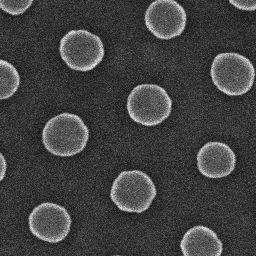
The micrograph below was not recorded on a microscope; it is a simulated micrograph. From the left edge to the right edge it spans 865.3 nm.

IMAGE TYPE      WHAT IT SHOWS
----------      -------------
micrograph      raised bodies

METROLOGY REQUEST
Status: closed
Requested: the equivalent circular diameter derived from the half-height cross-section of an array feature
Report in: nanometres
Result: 140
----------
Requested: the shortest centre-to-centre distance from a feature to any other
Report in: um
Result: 0.294